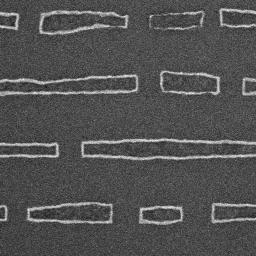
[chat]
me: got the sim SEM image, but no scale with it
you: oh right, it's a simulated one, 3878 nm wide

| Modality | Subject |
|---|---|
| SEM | one or a few lines or trenches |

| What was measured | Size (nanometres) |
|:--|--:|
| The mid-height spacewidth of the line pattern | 750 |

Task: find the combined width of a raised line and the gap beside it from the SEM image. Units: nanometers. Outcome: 979